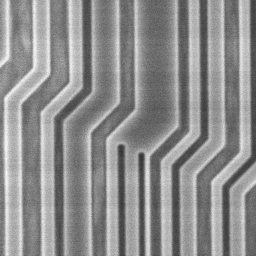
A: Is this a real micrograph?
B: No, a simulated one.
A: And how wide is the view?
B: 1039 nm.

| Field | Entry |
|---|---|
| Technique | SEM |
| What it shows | groups of lines, slits or small figures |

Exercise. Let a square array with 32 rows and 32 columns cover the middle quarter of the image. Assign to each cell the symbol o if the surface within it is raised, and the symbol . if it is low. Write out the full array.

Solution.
..oo...ooooooo....oooooooooo....
..oo...ooooooo....oooooooooo....
..oo...ooooooo....oooooooooo....
..oo...ooooooo....oooooooooo....
.ooo...ooooooo....oooooooooo....
.ooo...ooooooo....oooooooooo....
oooo...ooooooo....oooooooooo....
ooo....ooooooo....oooooooooo....
oo....oooooooo....oooooooooo....
o....ooooooooo....oooooooooo....
....ooooooooo.....oooooooooo....
...ooooooooo......oooooooooo....
..ooooooooo......ooooooooooo....
.ooooooooo......oooooooooooo....
ooooooooo......ooooooooooooo....
oooooooo......oooooooooooooo....
ooooooo......ooooooooooooooo....
ooooooo.....ooooooooooooooo....o
ooooooo....ooooooooooooooo....oo
ooooooo....oooooooooooooo....ooo
ooooooo....ooo.ooooooooo....ooo.
ooooooo....oo..oooooooo....ooo..
ooooooo....oo..oooo.oo....ooo...
ooooooo....oo..ooo..o....ooo....
ooooooo....oo..ooo..o....oo....o
ooooooo....oo..ooo..o....oo...oo
ooooooo....oo...oo..o....oo..ooo
ooooooo....oo...oo..o....oo..ooo
ooooooo....oo...oo..o....oo..ooo
ooooooo....oo...oo..o....oo..ooo
ooooooo....oo...oo..o....oo..ooo
ooooooo....oo...oo..o....oo..ooo